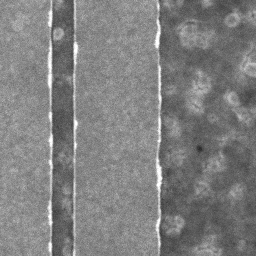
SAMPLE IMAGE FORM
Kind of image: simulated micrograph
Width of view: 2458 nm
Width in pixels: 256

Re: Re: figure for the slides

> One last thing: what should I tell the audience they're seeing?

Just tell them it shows one or a few lines or trenches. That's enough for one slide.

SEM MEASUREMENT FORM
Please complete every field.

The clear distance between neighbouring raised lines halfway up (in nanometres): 221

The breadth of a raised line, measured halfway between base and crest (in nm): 824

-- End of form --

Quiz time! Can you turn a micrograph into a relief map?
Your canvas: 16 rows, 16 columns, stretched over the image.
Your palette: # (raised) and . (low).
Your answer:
###..#####......
###..#####......
###..#####......
###..#####......
###..#####......
###..#####......
###..#####......
###..#####......
###..#####......
###..#####......
###..#####......
###..#####......
###..#####......
###..#####......
###..#####......
###..#####......